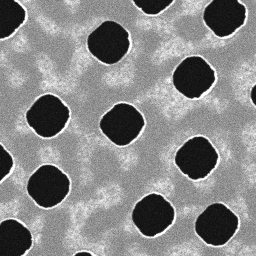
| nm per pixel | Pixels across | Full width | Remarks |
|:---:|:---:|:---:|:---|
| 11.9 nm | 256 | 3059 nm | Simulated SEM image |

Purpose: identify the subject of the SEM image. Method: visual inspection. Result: a regular array of holes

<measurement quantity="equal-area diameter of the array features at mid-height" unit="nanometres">495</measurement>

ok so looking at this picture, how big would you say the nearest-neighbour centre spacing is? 840 nanometers